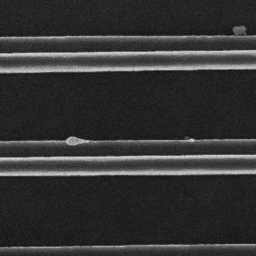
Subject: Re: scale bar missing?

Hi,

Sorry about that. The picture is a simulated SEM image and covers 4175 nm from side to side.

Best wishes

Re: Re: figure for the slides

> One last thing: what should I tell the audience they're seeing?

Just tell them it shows lines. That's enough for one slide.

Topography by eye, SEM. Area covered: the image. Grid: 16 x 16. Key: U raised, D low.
DDDDDDDDDDDDDDDD
DDDDDDDDDDDDDDDD
UUUUUUUUUUUUUUUU
UUUUUUUUUUUUUUUU
DDDDDDDDDDDDDDDD
DDDDDDDDDDDDDDDD
DDDDDDDDDDDDDDDD
DDDDDDDDDDDDDDDD
DDDDDDDDDDDDDDDD
UUUUUUUUUUUUUUUU
UUUUUUUUUUUUUUUU
DDDDDDDDDDDDDDDD
DDDDDDDDDDDDDDDD
DDDDDDDDDDDDDDDD
DDDDDDDDDDDDDDDD
DDUUUUUUUUUUUUUU